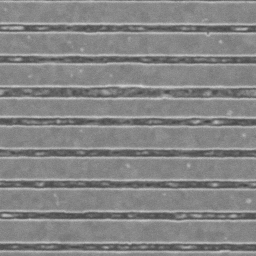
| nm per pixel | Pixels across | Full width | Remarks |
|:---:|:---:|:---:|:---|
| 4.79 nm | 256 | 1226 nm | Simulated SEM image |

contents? parallel lines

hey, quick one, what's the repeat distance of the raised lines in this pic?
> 0.149 microns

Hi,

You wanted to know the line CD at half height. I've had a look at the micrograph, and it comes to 110 nm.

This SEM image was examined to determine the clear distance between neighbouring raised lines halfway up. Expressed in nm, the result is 40.7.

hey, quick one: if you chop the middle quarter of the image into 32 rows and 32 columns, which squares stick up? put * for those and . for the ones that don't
********************************
********************************
********************************
********************************
********************************
***.*******........*************
................................
..........*.....................
........................**......
********************************
********************************
********************************
********************************
................................
................................
.*...............*..*..**....**.
********************************
********************************
********************************
********************************
********************************
................................
................................
*************...........**......
********************************
********************************
********************************
********************************
********************************
................................
................................
********************************